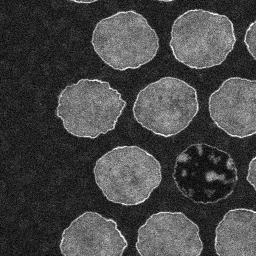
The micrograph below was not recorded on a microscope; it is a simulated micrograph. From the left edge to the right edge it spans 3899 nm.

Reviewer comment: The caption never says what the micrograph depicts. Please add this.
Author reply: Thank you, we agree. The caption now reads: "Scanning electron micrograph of holes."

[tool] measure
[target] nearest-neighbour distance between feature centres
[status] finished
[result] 1.16 micrometres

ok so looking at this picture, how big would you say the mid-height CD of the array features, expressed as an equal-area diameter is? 909 nm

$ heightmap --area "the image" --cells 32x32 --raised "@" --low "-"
@@@@@@@@@@@@@@@@@@@@@@@@@@@@@@@@
@@@@@@@@@@@@@@@@-@@@@@@@--@@@@@@
-@@@@@@@@@@@------@@@@-------@@@
@@@@@@@@@@@@-------@@@-------@@-
@@@@@@@@@@@@--------@--------@@-
@@@@@@@@@@@@--------@--------@@-
@@@@@@@@@@-@-------@@@-------@@-
@@@@@@@@@@@@@------@@@------@@@@
@@@@@@@@@@@@@@--@@@@@@@@@@@@@@@@
@@@@@@@@@@@@@@@@@@@@@@@@@@@@@@@@
@@@@@@@@@----@@@@@@----@@@@-----
-@@@@@@@-------@@@------@@@-----
@@@@@@@--------@@--------@------
@@@@@@@--------@@--------@------
@@@@@@@--------@@-------@@------
@@@@@@@@------@@@@-----@@@@-----
@@@@@@@@@----@@@@@@---@@@@@@----
@@@@@@@@@@@@@@-@@@@@@@@@-@@-@@@@
@@@@@@@@@@@@@@---@@@@@@@---@@@@@
@@@@@@@@@@@@@------@@@-------@@@
@@@@@@@@@@@@--------@@-------@@-
@@@@@@@@@@@@--------@@-------@@-
@@@@@@@@@@@@--------@@-------@@-
@@@@@@@@@@@@@------@@@-------@@@
@@@@@@@@@@@@@-----@@@@@-----@@@@
@@@@@@@@@@@@@@@@-@@@@@@@@@@@@@@@
@@@@@@@@@@@@@@@@@@@@@@@@@@@@@---
@@@@@@@@@-----@@@@@-----@@@@----
@@@@@@@@-------@@@-------@@-----
@@@@@@@@-------@@--------@@-----
@@@@@@@@--------@--------@@-----
@@@@@@@@-------@@--------@@-----